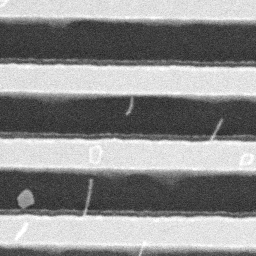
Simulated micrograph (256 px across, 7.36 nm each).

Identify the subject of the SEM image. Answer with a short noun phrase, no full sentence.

lines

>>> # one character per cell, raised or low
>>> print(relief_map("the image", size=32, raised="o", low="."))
oooooooooooooooooooooooooooooooo
oooooooooooooooooooooooooooooooo
................................
................................
................................
................................
................................
................................
oooooooooooooooooooooooooooooooo
oooooooooooooooooooooooooooooooo
oooooooooooooooooooooooooooooooo
.....ooooooooooooooooooooooooooo
................................
................................
................................
................................
................................
ooooooooooo.oooo................
oooooooooooooooooooooooooooooooo
oooooooooooooooooooooooooooooooo
oooooooooooooooooooooooooooooooo
................................
................................
................................
................................
................................
................................
oooooooooooooooooooooooooooooooo
oooooooooooooooooooooooooooooooo
oooooooooooooooooooooooooooooooo
.oooo.oooooooooooooooooooooooooo
................................